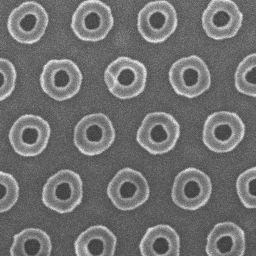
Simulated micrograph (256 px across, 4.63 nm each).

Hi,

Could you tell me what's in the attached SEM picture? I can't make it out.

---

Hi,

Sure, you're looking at a regular array of ring-shaped raised bodies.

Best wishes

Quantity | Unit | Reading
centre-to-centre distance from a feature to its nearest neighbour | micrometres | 0.293